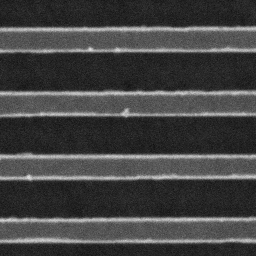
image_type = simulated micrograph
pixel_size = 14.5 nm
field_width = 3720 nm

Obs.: lines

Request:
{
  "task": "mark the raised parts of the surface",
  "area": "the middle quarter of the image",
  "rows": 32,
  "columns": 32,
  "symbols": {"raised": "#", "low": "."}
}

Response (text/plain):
................................
................................
................................
................................
................................
................................
................................
################################
################################
################################
################################
################################
################################
................................
................................
................................
................................
................................
................................
................................
................................
................................
................................
################################
################################
################################
################################
################################
################################
................................
................................
................................